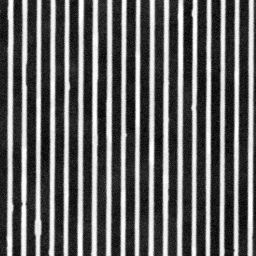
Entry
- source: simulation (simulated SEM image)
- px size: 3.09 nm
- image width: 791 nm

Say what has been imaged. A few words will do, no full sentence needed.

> parallel lines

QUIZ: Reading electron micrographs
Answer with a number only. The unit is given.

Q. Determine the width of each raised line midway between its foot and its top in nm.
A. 12.4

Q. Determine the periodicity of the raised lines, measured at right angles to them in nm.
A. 43.7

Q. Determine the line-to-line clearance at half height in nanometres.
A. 30.9